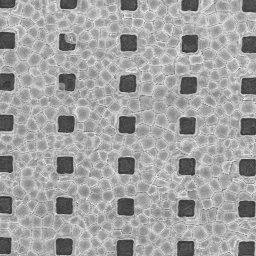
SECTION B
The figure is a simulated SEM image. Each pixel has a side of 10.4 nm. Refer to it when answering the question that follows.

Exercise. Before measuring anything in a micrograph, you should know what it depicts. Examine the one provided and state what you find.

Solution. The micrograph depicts a regular array of holes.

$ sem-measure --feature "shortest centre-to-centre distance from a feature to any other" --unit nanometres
425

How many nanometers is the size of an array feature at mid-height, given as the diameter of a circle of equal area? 202